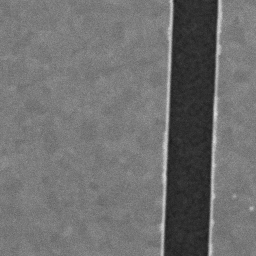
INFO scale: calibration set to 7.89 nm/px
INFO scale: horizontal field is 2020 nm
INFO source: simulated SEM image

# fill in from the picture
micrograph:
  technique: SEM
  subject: one or a few lines or trenches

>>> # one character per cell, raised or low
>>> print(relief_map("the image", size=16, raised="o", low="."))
ooooooooooo...oo
ooooooooooo...oo
ooooooooooo...oo
ooooooooooo...oo
ooooooooooo...oo
ooooooooooo...oo
oooooooooo...ooo
oooooooooo...ooo
oooooooooo...ooo
oooooooooo...ooo
oooooooooo...ooo
oooooooooo...ooo
oooooooooo...ooo
oooooooooo...ooo
oooooooooo...ooo
oooooooooo...ooo